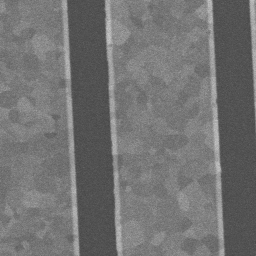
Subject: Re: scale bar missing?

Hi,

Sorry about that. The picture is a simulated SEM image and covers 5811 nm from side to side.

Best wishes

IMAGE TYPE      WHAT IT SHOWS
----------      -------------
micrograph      one or a few lines or trenches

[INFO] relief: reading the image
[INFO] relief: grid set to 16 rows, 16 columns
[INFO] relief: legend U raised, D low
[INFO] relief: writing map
UUUUDDDUUUUUUDDD
UUUUDDDUUUUUUDDD
UUUUDDDUUUUUUDDD
UUUUDDDUUUUUUDDD
UUUUDDDUUUUUUDDD
UUUUDDDUUUUUUDDD
UUUUDDDUUUUUUDDD
UUUUDDDUUUUUUDDD
UUUUDDDUUUUUUUDD
UUUUUDDUUUUUUUDD
UUUUUDDUUUUUUUDD
UUUUUDDUUUUUUUDD
UUUUUDDUUUUUUUDD
UUUUUDDUUUUUUUDD
UUUUUDDUUUUUUUDD
UUUUUDDUUUUUUUDD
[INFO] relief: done